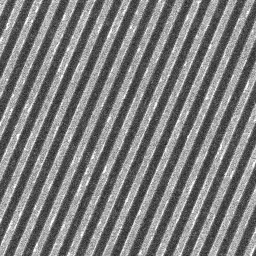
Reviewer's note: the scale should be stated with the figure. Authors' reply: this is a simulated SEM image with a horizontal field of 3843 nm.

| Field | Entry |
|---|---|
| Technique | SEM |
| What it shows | parallel lines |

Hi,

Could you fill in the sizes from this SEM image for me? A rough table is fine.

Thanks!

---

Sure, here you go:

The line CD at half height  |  116 nm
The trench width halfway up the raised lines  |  128 nm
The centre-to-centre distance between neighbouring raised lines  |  244 nanometers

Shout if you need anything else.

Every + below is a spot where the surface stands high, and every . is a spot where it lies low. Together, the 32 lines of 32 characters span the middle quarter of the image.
+..++...++..++...++..++..+++..++
+..++..++...++..++..++...++..++.
..+++..++..++...++..++..+++..++.
..++..++...++..++...++..++..+++.
.+++..++..++...++..++...++..++..
.++..+++..++..++...++..++...++..
.++..++...++..++..++...++..++..+
++...++..++...++..++..+++..++..+
++..++...++..++..++...++..++...+
++..++..++...++..++..+++..++..++
+..++...++..++...++..++..+++..++
+..++..++...++..++...++..++..+++
..+++..++..++...++..++...++..++.
..++...++..++..++...++..++..+++.
..++..++...++..++..+++..++..++..
.++...++..++..++...++..++...++..
.++..++...++..++..+++..++..++...
++...++..++...++..++..+++..++..+
++..++...++..++...++..++..+++..+
++..++..++...++..++...++..++...+
+...++..++..++...++..++..+++..++
+..++...++..++..++...++..++...++
...++..++..++...++..++...++..++.
..++...++..++..++...++..++...++.
..++..++...++..++..+++..++..++..
.++...++..++...++..++..+++..++..
.++..++...++..++...++..++...++..
.++..++..++...++..++..+++..++..+
++...++..++..++...++..++...++..+
++..++..++...++..++...++..++...+
+...++..++..++...++..++...++..++
+..++...++..++..+++..++..++...++